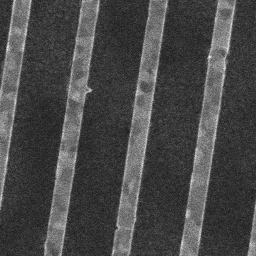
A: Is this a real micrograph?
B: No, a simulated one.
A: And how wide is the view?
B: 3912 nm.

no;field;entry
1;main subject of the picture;one or a few lines or trenches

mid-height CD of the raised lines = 262 nm